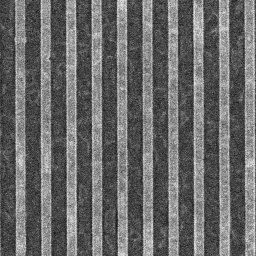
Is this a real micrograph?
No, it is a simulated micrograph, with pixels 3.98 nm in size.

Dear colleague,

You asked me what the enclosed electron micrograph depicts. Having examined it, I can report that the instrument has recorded parallel lines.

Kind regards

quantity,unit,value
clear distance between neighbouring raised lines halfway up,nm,66.2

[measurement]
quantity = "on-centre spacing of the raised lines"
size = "102 nanometers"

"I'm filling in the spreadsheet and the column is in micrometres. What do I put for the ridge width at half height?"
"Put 0.0348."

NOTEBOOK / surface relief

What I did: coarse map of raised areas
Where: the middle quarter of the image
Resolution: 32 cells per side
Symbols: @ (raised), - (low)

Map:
-@@----@@----@@-----@@----@@----
-@@----@@----@@@----@@----@@----
-@@----@@----@@@----@@----@@----
-@@----@@----@@@----@@----@@----
-@@----@@----@@@----@@----@@----
-@@----@@----@@@----@@----@@----
-@@----@@----@@-----@@----@@----
-@@----@@----@@-----@@----@@----
-@@----@@-----@-----@@----@@----
-@@----@@----@@-----@@----@@----
-@@----@@----@@-----@@----@@----
-@@----@@----@@-----@@----@@----
-@@----@@-----@-----@@----@@----
-@@----@@----@@@----@@----@@----
-@@----@@----@@@----@@----@@----
-@@----@@----@@@----@@----@@----
-@@----@@----@@@----@@----@@----
-@@----@@----@@@----@@----@@----
-@@----@@----@@@----@@----@@----
-@@----@@----@@@----@@----@@----
-@@----@@----@@@----@@----@@----
-@@----@@----@@@----@@----@@----
-@@----@@-----@@----@@----@@----
-@@----@@-----@@----@@----@@----
-@@----@@-----@@----@@----@@----
-@@----@@-----@@----@@----@@----
-@@----@@-----@@----@@----@@----
-@@----@@-----@@----@@----@@----
-@@----@@-----@@----@@----@@----
-@@----@@-----@@----@@----@@----
-@@----@@-----@@----@@----@@----
-@@----@@-----@@----@@----@@----